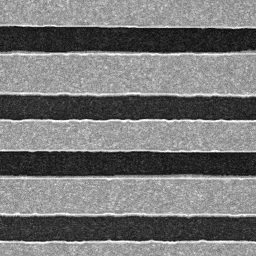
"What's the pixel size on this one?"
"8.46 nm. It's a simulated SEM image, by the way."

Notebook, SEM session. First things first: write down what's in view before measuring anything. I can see lines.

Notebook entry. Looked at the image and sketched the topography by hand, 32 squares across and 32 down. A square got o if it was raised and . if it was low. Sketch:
oooooooooooooooooooooooooooooooo
oooooooooooooooooooooooooooooooo
oooooooooooooooooooooooooooooooo
.............................o..
................................
................................
................................
oooooooooooooooooooooooooooooooo
oooooooooooooooooooooooooooooooo
oooooooooooooooooooooooooooooooo
oooooooooooooooooooooooooooooooo
oooooooooooooooooooooooooooooooo
................................
................................
................................
oooooooooooooooooooooooooooooooo
oooooooooooooooooooooooooooooooo
oooooooooooooooooooooooooooooooo
oooooooooooooooooooooooooooooooo
................................
................................
................................
oooooooooooooooooooooooooooooooo
oooooooooooooooooooooooooooooooo
oooooooooooooooooooooooooooooooo
oooooooooooooooooooooooooooooooo
oooooooooooooooooooooooooooooooo
................................
................................
................................
oooooooooooooooooooooooooooooooo
oooooooooooooooooooooooooooooooo